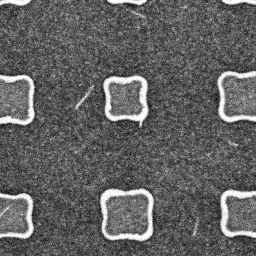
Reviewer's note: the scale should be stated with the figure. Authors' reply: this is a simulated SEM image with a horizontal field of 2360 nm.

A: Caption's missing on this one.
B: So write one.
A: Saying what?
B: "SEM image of raised bodies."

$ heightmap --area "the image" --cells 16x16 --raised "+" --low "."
................
................
................
................
................
++.....++.....++
++.....++.....++
++..............
................
................
................
................
++....+++.....++
++....+++.....++
++.....++.....++
................